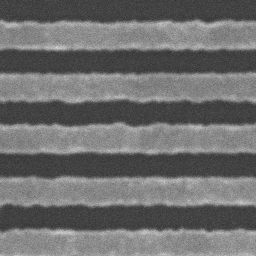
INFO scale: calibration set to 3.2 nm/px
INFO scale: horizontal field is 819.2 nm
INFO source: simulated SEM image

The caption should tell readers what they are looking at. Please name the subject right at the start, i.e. lines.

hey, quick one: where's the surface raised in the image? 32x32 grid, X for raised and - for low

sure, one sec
--------------------------------
--------------------------------
--------------------------------
XXXXXXXXXXXXXXXXXXXXXXXXXXXXXXXX
XXXXXXXXXXXXXXXXXXXXXXXXXXXXXXXX
XXXXXXXXXXXXXXXXXXXXXXXXXXXXXXXX
--------------------------------
--------------------------------
--------------------------------
XXXXXXXXXXXXXXXXXXXXXXXXXXXXXXXX
XXXXXXXXXXXXXXXXXXXXXXXXXXXXXXXX
XXXXXXXXXXXXXXXXXXXXXXXXXXXXXXXX
XX-XXX--XXXXXX--XXXXXX--XX--XXXX
--------------------------------
--------------------------------
--------------X-----------------
XXXXXXXXXXXXXXXXXXXXXXXXXXXXXXXX
XXXXXXXXXXXXXXXXXXXXXXXXXXXXXXXX
XXXXXXXXXXXXXXXXXXXXXXXXXXXXXXXX
--------------------------------
--------------------------------
--------------------------------
XXXXXXXXXXXXXXXXXXXXXXXXXXXXXXXX
XXXXXXXXXXXXXXXXXXXXXXXXXXXXXXXX
XXXXXXXXXXXXXXXXXXXXXXXXXXXXXXXX
X-XX-XXXX-XXXX-XX-X--XXXX--XXXXX
--------------------------------
--------------------------------
--------------------------------
XXXXXXXXXXXXXXXXXXXXXXXXXXXXXXXX
XXXXXXXXXXXXXXXXXXXXXXXXXXXXXXXX
XXXXXXXXXXXXXXXXXXXXXXXXXXXXXXXX